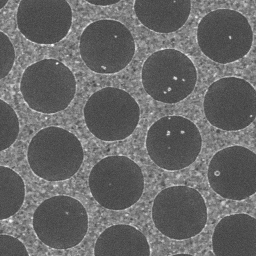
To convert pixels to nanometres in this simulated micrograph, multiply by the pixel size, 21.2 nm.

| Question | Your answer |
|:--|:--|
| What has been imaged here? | a regular array of holes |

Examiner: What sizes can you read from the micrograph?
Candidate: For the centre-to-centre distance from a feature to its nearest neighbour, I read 1440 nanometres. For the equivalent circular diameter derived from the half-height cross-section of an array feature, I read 55.8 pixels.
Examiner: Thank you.